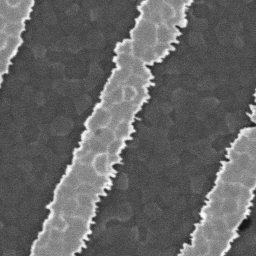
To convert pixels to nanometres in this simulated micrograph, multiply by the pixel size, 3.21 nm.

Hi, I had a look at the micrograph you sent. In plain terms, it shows one or a few lines or trenches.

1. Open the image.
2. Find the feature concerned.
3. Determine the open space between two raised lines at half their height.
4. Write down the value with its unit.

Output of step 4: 0.316 microns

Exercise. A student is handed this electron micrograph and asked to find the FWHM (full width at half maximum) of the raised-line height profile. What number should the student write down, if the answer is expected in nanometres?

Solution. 130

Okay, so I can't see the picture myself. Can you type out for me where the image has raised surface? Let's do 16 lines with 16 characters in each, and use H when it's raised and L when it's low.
HHLLLLLLLHHHLLLL
HHLLLLLLHHHLLLLL
HLLLLLLLHHHLLLLL
HLLLLLLHHHLLLLLL
LLLLLLLHHLLLLLLL
LLLLLLLHHLLLLLLL
LLLLLLHHHLLLLLLL
LLLLLLHHLLLLLLLL
LLLLLHHHLLLLLLLH
LLLLLHHHLLLLLLHH
LLLLHHHLLLLLLLHH
LLLLHHHLLLLLLHHH
LLLHHHLLLLLLLHHH
LLLHHHLLLLLLLHHL
LLLHHHLLLLLLHHHL
LLHHHLLLLLLLHHLL